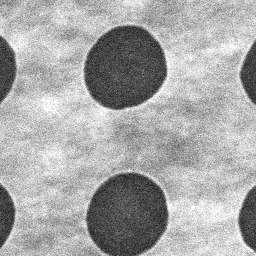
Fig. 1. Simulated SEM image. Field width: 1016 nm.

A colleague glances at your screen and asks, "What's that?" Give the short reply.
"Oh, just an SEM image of holes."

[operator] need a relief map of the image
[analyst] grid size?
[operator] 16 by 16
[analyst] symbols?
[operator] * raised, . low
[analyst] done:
****************
****************
******....******
.****.....*****.
.****.....*****.
.****.....*****.
******...*******
****************
****************
****************
****************
******....******
.*****....*****.
.****......****.
.****.....*****.
******...*******